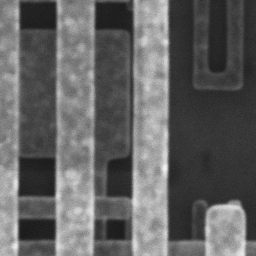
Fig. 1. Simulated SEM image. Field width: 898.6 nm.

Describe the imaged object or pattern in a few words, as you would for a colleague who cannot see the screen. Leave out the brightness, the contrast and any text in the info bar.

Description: wiring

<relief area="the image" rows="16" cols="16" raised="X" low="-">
X---XX--XX------
X---XX--XX------
X---XX--XX------
X---XX--XX------
X---XX--XX------
X---XX--XX------
X---XX--XX------
X---XX--XX------
X---XX--XX------
X---XX--XX------
X---XX--XX------
X---XX--XX------
XXXXXXXXXX------
XXXXXXXXXX---XX-
X---XX--XX---XX-
XXXXXXXXXXXXXXXX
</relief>